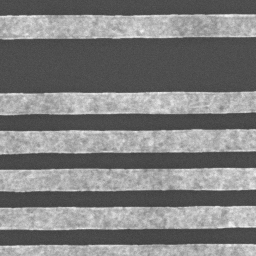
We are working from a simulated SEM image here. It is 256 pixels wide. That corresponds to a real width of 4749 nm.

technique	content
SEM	wiring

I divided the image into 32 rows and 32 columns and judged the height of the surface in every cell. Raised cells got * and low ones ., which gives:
................................
................................
********************************
********************************
********************************
................................
................................
................................
................................
................................
................................
................................
********************************
********************************
................................
................................
.......*****.*******************
********************************
********************************
................................
................................
********************************
********************************
********************************
................................
................................
********************************
********************************
***************************.....
................................
................................
********************************